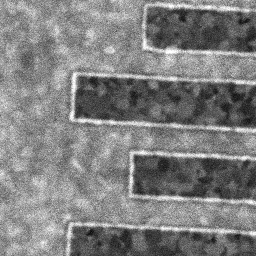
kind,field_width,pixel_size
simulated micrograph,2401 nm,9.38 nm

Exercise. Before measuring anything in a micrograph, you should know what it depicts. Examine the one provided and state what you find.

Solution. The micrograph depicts one or a few lines or trenches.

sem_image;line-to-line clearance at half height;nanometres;269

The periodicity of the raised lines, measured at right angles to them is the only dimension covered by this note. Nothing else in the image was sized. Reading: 73.9 px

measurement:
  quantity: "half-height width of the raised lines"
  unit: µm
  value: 0.419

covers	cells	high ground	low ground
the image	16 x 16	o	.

.........oooo...
.........ooooooo
.........ooooooo
................
................
.....ooooooooooo
.....ooooooooooo
.....ooooooooooo
................
................
........oooooooo
........oooooooo
.............ooo
................
....ooooooooooo.
....oooooooooooo